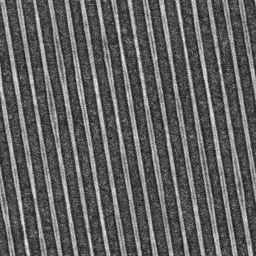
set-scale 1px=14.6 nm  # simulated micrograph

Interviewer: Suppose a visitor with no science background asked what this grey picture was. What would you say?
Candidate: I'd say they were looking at parallel lines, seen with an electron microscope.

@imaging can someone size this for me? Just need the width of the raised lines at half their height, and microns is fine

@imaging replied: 0.0397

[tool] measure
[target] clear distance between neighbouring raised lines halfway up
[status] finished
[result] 187 nanometers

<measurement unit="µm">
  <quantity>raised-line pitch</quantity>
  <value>0.229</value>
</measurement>